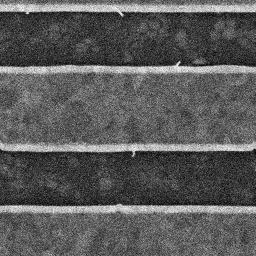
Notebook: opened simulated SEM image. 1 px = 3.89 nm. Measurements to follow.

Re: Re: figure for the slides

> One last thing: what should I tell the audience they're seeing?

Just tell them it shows one or a few lines or trenches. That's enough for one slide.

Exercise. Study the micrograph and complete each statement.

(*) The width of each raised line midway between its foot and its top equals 311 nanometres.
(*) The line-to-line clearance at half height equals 234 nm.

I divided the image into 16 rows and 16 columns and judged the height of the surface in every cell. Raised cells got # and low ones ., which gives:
################
................
................
................
################
################
################
################
################
................
................
................
................
################
################
################